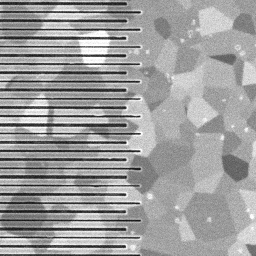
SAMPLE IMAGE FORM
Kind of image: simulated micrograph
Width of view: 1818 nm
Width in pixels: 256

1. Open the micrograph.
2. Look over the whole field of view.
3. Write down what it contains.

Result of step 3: parallel lines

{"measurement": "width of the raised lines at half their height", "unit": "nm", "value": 40.8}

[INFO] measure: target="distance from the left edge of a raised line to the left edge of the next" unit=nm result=61.6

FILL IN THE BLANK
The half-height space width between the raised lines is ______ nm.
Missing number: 18.6